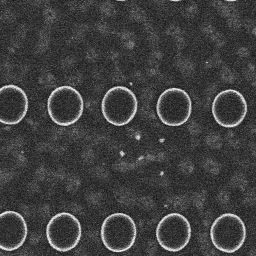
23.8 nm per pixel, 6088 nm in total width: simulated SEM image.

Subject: a regular array of raised bodies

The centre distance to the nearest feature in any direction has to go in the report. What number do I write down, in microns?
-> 1.3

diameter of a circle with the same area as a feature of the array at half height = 839 nm